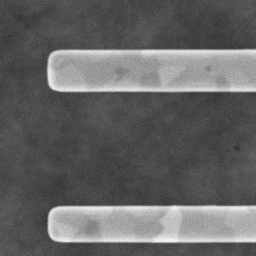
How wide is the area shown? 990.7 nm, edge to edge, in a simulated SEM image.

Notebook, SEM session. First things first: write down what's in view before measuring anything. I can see wiring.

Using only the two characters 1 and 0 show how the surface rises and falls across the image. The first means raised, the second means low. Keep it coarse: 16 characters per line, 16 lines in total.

0000000000000000
0000000000000000
0000000000000000
0001111111111111
0001111111111111
0001111111111111
0000000000000000
0000000000000000
0000000000000000
0000000000000000
0000000000000000
0000000000000000
0000000000000000
0001111111111111
0001111111111111
0000000000000000